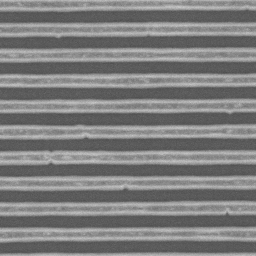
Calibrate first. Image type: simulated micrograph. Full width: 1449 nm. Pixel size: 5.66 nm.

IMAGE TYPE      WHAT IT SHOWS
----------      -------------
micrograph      parallel lines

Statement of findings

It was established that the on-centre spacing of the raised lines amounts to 0.145 microns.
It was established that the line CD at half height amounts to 62.2 nm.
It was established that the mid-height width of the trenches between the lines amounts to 82 nm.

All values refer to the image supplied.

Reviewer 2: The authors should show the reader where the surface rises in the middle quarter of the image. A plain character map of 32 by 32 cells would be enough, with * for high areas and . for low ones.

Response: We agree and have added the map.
................................
................................
................................
********************************
********************************
......*****************.........
................................
................................
................................
.*******************************
********************************
********************************
................................
................................
................................
................................
********************************
********************************
................................
................................
................................
................................
********************************
********************************
********************......******
................................
................................
................................
........................*.......
********************************
********************************
................................